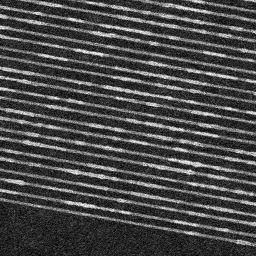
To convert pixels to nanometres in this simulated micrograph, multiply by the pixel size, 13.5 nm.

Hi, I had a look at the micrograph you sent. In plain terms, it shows parallel lines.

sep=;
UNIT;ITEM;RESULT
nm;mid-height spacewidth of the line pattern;99.4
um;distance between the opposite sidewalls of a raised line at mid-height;0.0298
